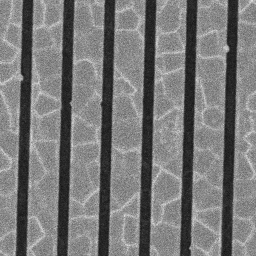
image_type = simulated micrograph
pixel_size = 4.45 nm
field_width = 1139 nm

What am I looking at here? parallel lines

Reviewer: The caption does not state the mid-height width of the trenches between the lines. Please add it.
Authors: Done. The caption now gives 10.7 pixels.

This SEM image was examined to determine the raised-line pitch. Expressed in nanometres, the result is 182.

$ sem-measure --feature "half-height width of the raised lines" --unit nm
135